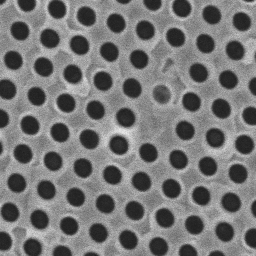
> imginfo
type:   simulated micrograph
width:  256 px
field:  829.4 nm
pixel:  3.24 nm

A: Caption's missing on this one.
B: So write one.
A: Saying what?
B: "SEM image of a regular array of holes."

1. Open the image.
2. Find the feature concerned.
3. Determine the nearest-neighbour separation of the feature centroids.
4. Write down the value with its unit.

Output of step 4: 95.9 nanometres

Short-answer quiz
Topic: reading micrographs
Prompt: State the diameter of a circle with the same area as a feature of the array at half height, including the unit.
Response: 61.1 nanometres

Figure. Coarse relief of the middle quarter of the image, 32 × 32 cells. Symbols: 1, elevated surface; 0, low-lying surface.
10011111111111111000011111111111
00001111111111111111111111111110
00001111000111111111111111111110
00001110000011110111111111111111
10001110000011100001111111111111
11111111000011100001111111111111
11111111100111100001111111111111
01111111111111100001111001111100
00111111111111111111111000111100
00011100011111111111111101111100
00011100001111111111111111111100
00111100001111000111111111111110
11111100001110000011111111111111
11111110011110000011111111111111
11111111111111000011111111111001
01111111111111000111111111110000
01111001111111111111111111110000
01110000111111111111111111110000
01110000011100011111111111111000
11110000011000001111111111111111
11111000111000001110000111111111
11111111111100001110000111110111
11111111111110011110000111100011
11111111111111111110000111000001
11100011111111111111101111000001
11000001111011111111111111100001
11000001110000111111111111111111
11100001110000111100011111111111
11111111110000111000011111111111
11111111111000111000001110001111
11111111111111111000001110000111
10001111111111111100011110000111